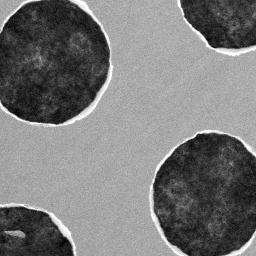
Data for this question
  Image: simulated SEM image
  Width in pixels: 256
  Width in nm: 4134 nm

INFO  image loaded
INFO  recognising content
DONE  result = holes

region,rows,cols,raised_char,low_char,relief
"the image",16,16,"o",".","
o....oooooo.....
......oooooo....
.......oooooo...
.......ooooooooo
.......ooooooooo
......oooooooooo
......oooooooooo
o...oooooooooooo
oooooooooooo..oo
ooooooooooo.....
oooooooooo......
oooooooooo......
ooooooooo.......
...ooooooo......
....oooooo......
.....oooooo....o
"